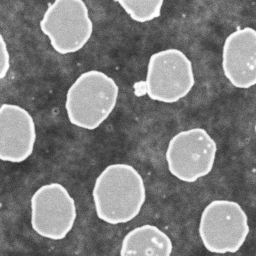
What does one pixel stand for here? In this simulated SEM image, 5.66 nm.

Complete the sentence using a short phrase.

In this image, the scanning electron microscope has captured raised bodies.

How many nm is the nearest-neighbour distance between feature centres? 447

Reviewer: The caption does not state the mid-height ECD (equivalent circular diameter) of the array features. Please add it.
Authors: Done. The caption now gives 284 nanometres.